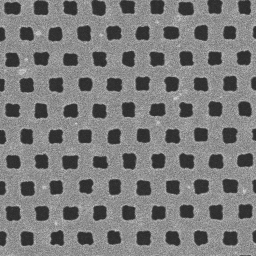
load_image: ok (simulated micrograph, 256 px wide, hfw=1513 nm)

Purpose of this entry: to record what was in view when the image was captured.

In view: a regular array of holes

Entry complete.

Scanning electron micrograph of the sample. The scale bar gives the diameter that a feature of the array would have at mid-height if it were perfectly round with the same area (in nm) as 88.2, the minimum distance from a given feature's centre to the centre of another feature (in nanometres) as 169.